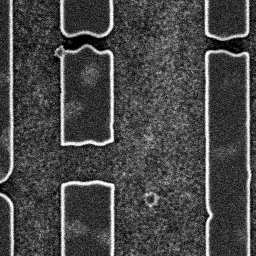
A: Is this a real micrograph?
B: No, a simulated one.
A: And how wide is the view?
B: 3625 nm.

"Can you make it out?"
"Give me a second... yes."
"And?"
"one or a few lines or trenches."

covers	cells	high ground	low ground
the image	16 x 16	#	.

#...###......##.
#...###......##.
#...............
#...###......##.
#...###......###
#...###......###
#...###......###
#...###......###
#...###......###
#............###
#............###
....###......###
....###......###
#...###......###
#...###......###
#...###......###